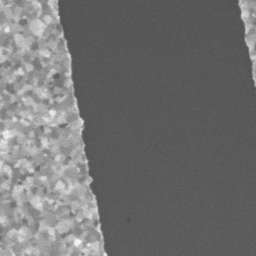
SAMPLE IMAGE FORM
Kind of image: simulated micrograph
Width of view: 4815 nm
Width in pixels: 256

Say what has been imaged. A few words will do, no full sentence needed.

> one or a few lines or trenches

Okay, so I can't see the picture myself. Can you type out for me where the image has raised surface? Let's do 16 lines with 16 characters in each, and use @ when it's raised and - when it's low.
@@@@-----------@
@@@@-----------@
@@@@-----------@
@@@@------------
@@@@------------
@@@@@-----------
@@@@@-----------
@@@@@-----------
@@@@@-----------
@@@@@-----------
@@@@@-----------
@@@@@@----------
@@@@@@----------
@@@@@@----------
@@@@@@----------
@@@@@@@---------